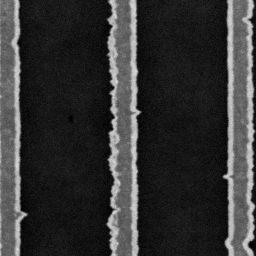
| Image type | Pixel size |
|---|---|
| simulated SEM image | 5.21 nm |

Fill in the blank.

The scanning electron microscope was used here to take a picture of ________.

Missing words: one or a few lines or trenches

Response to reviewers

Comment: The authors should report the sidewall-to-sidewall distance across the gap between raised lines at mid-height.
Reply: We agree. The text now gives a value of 96.4 pixels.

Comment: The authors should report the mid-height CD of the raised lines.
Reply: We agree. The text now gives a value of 0.107 um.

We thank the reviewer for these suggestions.